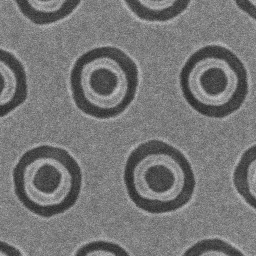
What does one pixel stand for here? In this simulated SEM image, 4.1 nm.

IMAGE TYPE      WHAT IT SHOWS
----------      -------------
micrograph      ring-shaped grooves with a dot in the middle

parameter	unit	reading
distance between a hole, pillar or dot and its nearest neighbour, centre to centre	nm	454